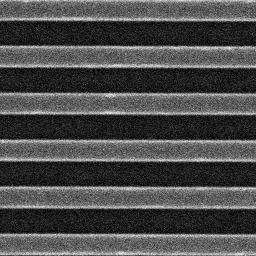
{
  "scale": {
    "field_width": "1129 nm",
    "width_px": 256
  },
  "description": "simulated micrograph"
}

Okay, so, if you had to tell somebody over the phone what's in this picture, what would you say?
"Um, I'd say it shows parallel lines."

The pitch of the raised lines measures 208 nm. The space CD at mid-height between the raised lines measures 119 nanometers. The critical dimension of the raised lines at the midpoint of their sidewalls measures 88.3 nanometres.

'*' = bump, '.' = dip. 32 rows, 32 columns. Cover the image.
********************************
********************************
..........***...**.**********..*
................................
................................
................................
********************************
********************************
................................
................................
................................
................................
********************************
********************************
................................
................................
................................
................................
********************************
********************************
................................
................................
................................
..**.**..******.*......*........
********************************
********************************
................................
................................
................................
********************************
********************************
********************************